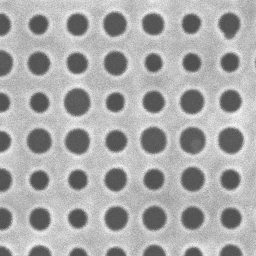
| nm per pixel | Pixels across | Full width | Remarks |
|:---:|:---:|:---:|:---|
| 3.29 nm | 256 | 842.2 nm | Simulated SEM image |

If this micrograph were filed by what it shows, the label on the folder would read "a regular array of holes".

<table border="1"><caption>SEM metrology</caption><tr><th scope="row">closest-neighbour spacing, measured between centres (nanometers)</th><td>125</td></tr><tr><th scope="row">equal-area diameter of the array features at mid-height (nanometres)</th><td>76.9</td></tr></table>